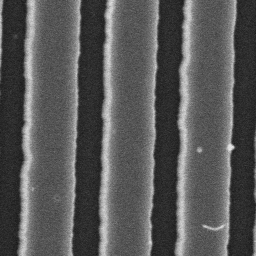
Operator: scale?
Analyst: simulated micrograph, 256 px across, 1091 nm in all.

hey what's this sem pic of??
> lines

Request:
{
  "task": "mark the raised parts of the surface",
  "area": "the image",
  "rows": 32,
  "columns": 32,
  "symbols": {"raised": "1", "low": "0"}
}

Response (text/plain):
00001111110000111111000111111100
00001111110001111111000111111000
00011111110001111111000111111000
00001111110001111111000111111000
00011111110001111111000111111000
00011111110001111111000111111000
00011111110001111111000111111000
00011111110001111111000111111000
00011111110001111111000111111000
00011111110001111110000111111000
00011111110001111110000111111000
00011111110001111110000111111000
00011111110001111110000111111000
00011111110001111110000111111000
00011111110001111110001111111000
00011111110001111110001111111000
00011111110001111110000111111000
00011111100001111110000111111000
00011111100001111110000111111000
00011111100001111110000111111000
00011111100001111110001111111000
00011111100001111110001111111000
00011111100001111110001111111000
00011111100001111110001111111000
00011111100001111110001111111000
00011111100001111110001111111000
00011111100001111110001111111000
00011111100001111110001111111000
00011111100001111110001111111000
00011111100001111110001111111000
00011111100001111110001111110000
00111111100001111110001111110000